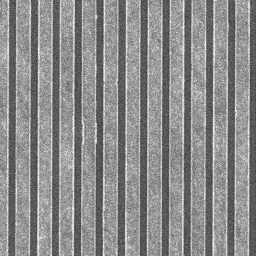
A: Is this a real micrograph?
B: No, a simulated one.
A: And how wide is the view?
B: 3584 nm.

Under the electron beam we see parallel lines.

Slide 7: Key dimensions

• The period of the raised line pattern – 0.307 µm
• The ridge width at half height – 201 nanometers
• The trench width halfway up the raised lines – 108 nm